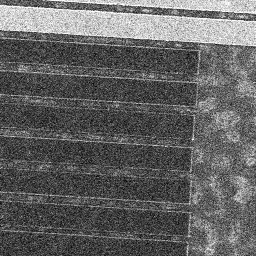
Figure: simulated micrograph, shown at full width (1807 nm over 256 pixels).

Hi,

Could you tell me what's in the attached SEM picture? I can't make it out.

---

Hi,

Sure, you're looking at parallel lines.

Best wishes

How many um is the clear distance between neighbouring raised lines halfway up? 0.0599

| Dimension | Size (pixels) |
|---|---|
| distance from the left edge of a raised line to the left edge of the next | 32.3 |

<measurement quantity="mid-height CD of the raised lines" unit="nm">173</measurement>